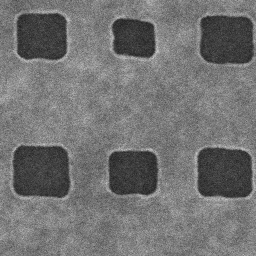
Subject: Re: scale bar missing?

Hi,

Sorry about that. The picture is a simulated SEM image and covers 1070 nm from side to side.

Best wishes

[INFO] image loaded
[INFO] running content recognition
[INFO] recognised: holes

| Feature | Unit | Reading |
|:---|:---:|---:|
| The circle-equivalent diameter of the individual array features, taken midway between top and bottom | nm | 229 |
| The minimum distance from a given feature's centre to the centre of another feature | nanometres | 385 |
